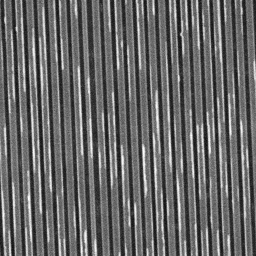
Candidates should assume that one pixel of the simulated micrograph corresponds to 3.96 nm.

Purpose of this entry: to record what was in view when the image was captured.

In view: parallel lines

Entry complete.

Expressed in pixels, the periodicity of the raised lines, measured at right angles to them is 11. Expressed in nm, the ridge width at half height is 25.2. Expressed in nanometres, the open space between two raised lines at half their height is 15.8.